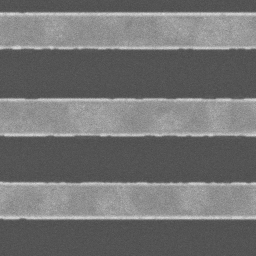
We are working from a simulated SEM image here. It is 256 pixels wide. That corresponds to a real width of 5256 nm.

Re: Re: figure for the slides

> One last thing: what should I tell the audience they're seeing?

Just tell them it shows lines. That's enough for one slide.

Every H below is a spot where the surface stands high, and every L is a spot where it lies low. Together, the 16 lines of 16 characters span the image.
LLLLLLLLLLLLLLLL
HHHHHHHHHHHHHHHH
HHHHHHHHHHHHHHHH
LLLLLLLLLLLLLLLL
LLLLLLLLLLLLLLLL
LLLLLLLLLLLLLLLL
HHHHHHHHHHHHHHHH
HHHHHHHHHHHHHHHH
LLLLLLLLLLLLLLLL
LLLLLLLLLLLLLLLL
LLLLLLLLLLLLLLLL
HHHHHHHHHHHHHHHH
HHHHHHHHHHHHHHHH
HHHHHHHHHHHHHHHH
LLLLLLLLLLLLLLLL
LLLLLLLLLLLLLLLL